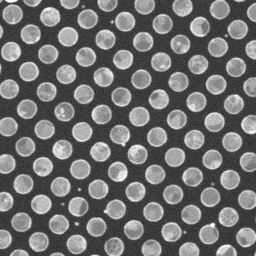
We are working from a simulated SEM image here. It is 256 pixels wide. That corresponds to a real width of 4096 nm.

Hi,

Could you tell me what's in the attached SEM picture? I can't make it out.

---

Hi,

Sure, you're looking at a regular array of raised bodies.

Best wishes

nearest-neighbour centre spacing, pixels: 26.2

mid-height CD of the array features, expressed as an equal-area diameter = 18.8 pixels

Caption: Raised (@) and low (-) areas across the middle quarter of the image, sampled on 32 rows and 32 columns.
@------------@@@------@@@@-----@
@@@-----@@@------------@@-------
@@@-----@@@@------@@@------@@@--
@@@-----@@@@-----@@@@@-----@@@@-
@@------@@@@-----@@@@@----@@@@@-
----@@------------@@@------@@@@-
---@@@@------@@@------------@@--
---@@@@-----@@@@@-----@@@@------
---@@@@-----@@@@@----@@@@@-----@
----@@------@@@@-----@@@@@-----@
@@-------@------------@@@------@
@@-----@@@@------@@@------------
@@-----@@@@@-----@@@@-----@@@@--
@@-----@@@@@-----@@@@-----@@@@--
--------@@@------@@@@-----@@@@--
---@@@-------@-------------@@@--
--@@@@@-----@@@@------@@@-------
--@@@@@-----@@@@-----@@@@------@
---@@@------@@@@-----@@@@@----@@
@------------@@------@@@@-----@@
@@------@@@------@@------------@
@@-----@-@@-----@@@@------@@@---
@@-----@@@@-----@@@@@-----@@@@--
@------@@@@-----@@@@@----@@@@@--
---@@@-----------@@@------@@@@--
--@@@@------@@@-------@----@----
--@@@@-----@@@@@-----@@@@------@
--@@@@-----@@@@@-----@@@@-----@@
---@@-------@@@------@@@@-----@@
@------@@@------------@@------@@
@-----@@@@@-----@@@@-------@----
@-----@@@@@-----@@@@-----@@@@---